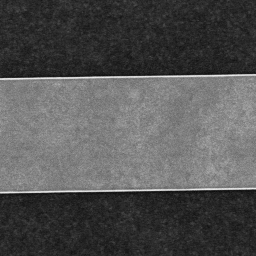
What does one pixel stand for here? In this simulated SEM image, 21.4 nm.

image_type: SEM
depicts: one or a few lines or trenches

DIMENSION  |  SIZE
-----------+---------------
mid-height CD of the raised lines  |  114 pixels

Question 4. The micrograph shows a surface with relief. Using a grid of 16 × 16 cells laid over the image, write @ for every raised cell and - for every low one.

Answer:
----------------
----------------
----------------
----------------
----------------
@@@@@@@@@@@@@@@@
@@@@@@@@@@@@@@@@
@@@@@@@@@@@@@@@@
@@@@@@@@@@@@@@@@
@@@@@@@@@@@@@@@@
@@@@@@@@@@@@@@@@
@@@@@@@@@@@@@@@@
----------------
----------------
----------------
----------------